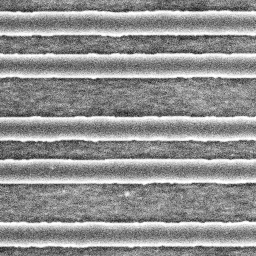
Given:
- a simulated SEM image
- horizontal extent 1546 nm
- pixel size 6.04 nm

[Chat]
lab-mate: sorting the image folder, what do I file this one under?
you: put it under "lines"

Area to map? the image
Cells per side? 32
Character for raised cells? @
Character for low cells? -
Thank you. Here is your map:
--------------------------------
----------@@-------@@@@---@-@---
@@@@@@@@@@@@@@@@@@@@@@@@@@@@@@@@
@@@@@@@@@@@@@@@@@@@@@@@@@@@@@@@@
--------------@-----------------
--------------------------------
--------------------------------
@@@@@@@@@@@@@@@@@@@@@@@@@@@@@@@@
@@@@@@@@@@@@@@@@@@@@@@@@@@@@@@@@
@@@@@@@@@@@@@@@@@@@@@@@@@@@@@@@@
--------------------------------
--------------------------------
--------------------------------
--------------------------------
--------------------------------
@@@@@@@@@@@@@@@@@@@@@@@@@@@@@@@@
@@@@@@@@@@@@@@@@@@@@@@@@@@@@@@@@
--@@@@@----@-------------@-@@---
--------------------------------
--------------------------------
@@@@@@@@@@@@@@@@@@@@@@@@@@@@@@@@
@@@@@@@@@@@@@@@@@@@@@@@@@@@@@@@@
@@@@@@@@@@@@@@@@@@@@@@@@@@@@@@@@
--------------------------------
--------------------------------
--------------------------------
--------------------------------
--------------------------------
@@@@@@@@@@@@@@@@@@@@@@@@@@@@@@@@
@@@@@@@@@@@@@@@@@@@@@@@@@@@@@@@@
@@@@@@@@@@@@@@@@@@@@@@@@@@@@@@@@
--------------------------------